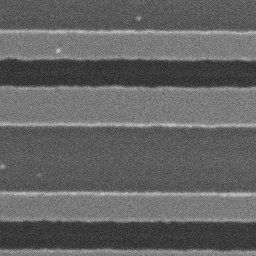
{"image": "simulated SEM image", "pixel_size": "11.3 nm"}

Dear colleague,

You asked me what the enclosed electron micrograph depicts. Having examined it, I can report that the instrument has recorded lines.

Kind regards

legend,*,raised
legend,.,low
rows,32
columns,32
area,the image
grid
................................
................................
................................
................................
********************************
********************************
********************************
................................
................................
................................
................................
********************************
********************************
********************************
********************************
********************************
................................
................................
................................
................................
................................
................................
................................
................................
********************************
********************************
********************************
..*.*.*.*.***.******************
................................
................................
................................
******************************.*